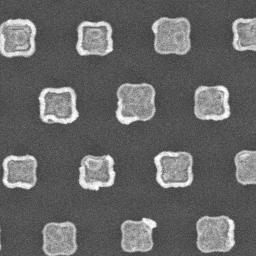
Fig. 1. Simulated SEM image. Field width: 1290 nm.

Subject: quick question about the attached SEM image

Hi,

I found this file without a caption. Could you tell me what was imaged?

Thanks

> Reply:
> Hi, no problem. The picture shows a regular array of raised bodies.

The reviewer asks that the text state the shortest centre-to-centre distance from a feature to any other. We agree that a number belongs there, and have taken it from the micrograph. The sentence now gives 383 nm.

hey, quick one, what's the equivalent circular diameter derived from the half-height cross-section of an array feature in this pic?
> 191 nm